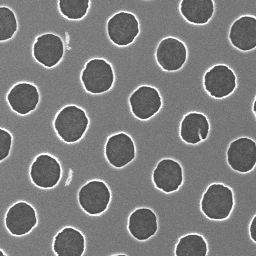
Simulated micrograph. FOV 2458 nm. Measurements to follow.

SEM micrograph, a regular array of holes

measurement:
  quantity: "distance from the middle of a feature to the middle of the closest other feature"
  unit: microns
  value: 0.518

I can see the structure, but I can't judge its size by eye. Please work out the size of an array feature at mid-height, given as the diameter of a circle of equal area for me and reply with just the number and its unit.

0.303 micrometres